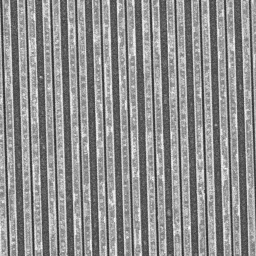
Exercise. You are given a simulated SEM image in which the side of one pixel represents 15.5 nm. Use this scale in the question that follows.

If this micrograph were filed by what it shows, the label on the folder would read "parallel lines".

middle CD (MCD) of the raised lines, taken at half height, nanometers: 98.6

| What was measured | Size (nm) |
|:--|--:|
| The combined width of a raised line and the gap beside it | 194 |